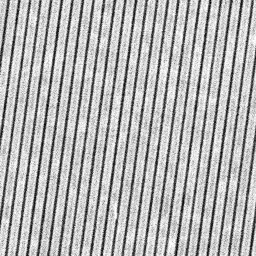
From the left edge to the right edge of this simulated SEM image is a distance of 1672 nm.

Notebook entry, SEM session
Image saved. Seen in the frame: parallel lines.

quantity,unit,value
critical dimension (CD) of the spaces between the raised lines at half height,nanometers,19.4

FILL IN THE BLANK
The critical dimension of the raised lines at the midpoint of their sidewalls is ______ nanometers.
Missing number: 45.3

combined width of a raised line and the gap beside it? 68.6 nanometres